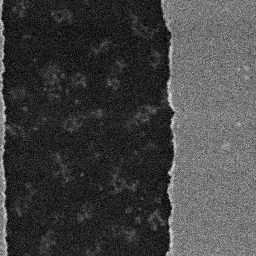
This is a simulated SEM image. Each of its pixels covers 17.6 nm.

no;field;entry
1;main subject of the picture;one or a few lines or trenches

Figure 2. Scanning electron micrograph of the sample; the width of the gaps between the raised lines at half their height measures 2.92 µm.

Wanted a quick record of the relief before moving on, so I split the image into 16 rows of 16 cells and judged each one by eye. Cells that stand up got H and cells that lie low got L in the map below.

LLLLLLLLLLHHHHHH
LLLLLLLLLLHHHHHH
LLLLLLLLLLLHHHHH
LLLLLLLLLLLHHHHH
LLLLLLLLLLLHHHHH
LLLLLLLLLLLHHHHH
LLLLLLLLLLLHHHHH
LLLLLLLLLLLHHHHH
LLLLLLLLLLLHHHHH
LLLLLLLLLLLHHHHH
LLLLLLLLLLLHHHHH
LLLLLLLLLLLHHHHH
LLLLLLLLLLLHHHHH
LLLLLLLLLLLHHHHH
LLLLLLLLLLLHHHHH
LLLLLLLLLLLHHHHH